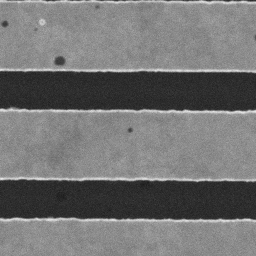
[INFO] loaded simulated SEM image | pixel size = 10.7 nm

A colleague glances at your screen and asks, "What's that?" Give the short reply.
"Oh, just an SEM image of lines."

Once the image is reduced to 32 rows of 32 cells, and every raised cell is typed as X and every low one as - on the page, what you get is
XXXXXXXXXXXXXXXXXXXXXXXXXXXXXXXX
XXXXXXXXXXXXXXXXXXXXXXXXXXXXXXXX
XXXXXXXXXXXXXXXXXXXXXXXXXXXXXXXX
XXXXXXXXXXXXXXXXXXXXXXXXXXXXXXXX
XXXXXXXXXXXXXXXXXXXXXXXXXXXXXXXX
XXXXXXXXXXXXXXXXXXXXXXXXXXXXXXXX
XXXXXXXXXXXXXXXXXXXXXXXXXXXXXXXX
XXXXXXXXXXXXXXXXXXXXXXXXXXXXXXXX
XXXXXXXXXXXXXXXXXXXXXXXXXXXXXXXX
--------------------------------
--------------------------------
--------------------------------
--------------------------------
--------------------------------
XXXXXXXXXXXXXXXXXXXXXXXXXXXXXXXX
XXXXXXXXXXXXXXXXXXXXXXXXXXXXXXXX
XXXXXXXXXXXXXXXXXXXXXXXXXXXXXXXX
XXXXXXXXXXXXXXXXXXXXXXXXXXXXXXXX
XXXXXXXXXXXXXXXXXXXXXXXXXXXXXXXX
XXXXXXXXXXXXXXXXXXXXXXXXXXXXXXXX
XXXXXXXXXXXXXXXXXXXXXXXXXXXXXXXX
XXXXXXXXXXXXXXXXXXXXXXXXXXXXXXXX
-------X-XX---XXX-XXX-XXXXXXXXXX
--------------------------------
--------------------------------
--------------------------------
--------------------------------
XXXXXXXXXXXXXXXXXXX-XXXX-X-X-XXX
XXXXXXXXXXXXXXXXXXXXXXXXXXXXXXXX
XXXXXXXXXXXXXXXXXXXXXXXXXXXXXXXX
XXXXXXXXXXXXXXXXXXXXXXXXXXXXXXXX
XXXXXXXXXXXXXXXXXXXXXXXXXXXXXXXX